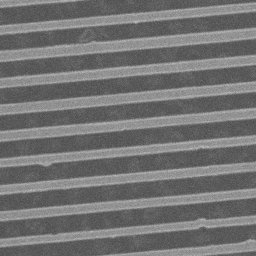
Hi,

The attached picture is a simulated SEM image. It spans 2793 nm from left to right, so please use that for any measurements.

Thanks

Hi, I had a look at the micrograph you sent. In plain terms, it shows parallel lines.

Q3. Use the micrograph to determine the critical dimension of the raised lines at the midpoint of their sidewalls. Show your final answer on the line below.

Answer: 92.3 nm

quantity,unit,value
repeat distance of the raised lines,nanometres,289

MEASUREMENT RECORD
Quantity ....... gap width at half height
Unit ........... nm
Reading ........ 193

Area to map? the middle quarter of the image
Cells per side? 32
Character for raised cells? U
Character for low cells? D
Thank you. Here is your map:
DDDDDDDDDDDDDDDDDDDUUUUUUUUUUUUU
DDDDDDDDUUUUUUUUUUUUUUUUUUUUUUUU
UUUUUUUUUUUUUUUUUUUUUDDDDDDDDDDD
UUUUUUUUUUDDDDDDDDDDDDDDDDDDDDDD
DDDDDDDDDDDDDDDDDDDDDDDDDDDDDDDD
DDDDDDDDDDDDDDDDDDDDDDDDDDDDDDDD
DDDDDDDDDDDDDDDDDDDDDDDDDUUUUUUU
DDDDDDDDDDDDDDDDDUUUUUUUUUUUUUUU
DDDUDDUUUUUUUUUUUUUUUUUUUUUUUDDD
UUUUUUUUUUUUUUUUUUDDDDDDDDDDDDDD
UUUUUUUDDDDDDDDDDDDDDDDDDDDDDDDD
DDDDDDDDDDDDDDDDDDDDDDDDDDDDDDDD
DDDDDDDDDDDDDDDDDDDDDDDDDDDDDDDD
DDDDDDDDDDDDDDDDDDDDDDDUUUUUUUUU
DDDDDDDDDDDDDDUUUUUUUUUUUUUUUUUU
DUUUUUUUUUUUUUUUUUUUUUUUDDDDDDDD
UUUUUUUUUUUUUDDDDDDDDDDDDDDDDDDD
UUDDUDDDDDDDDDDDDDDDDDDDDDDDDDDD
DDDDDDDDDDDDDDDDDDDDDDDDDDDDDDDD
DDDDDDDDDDDDDDDDDDDDDDDDDDDDDDDU
DDDDDDDDDDDDDDDDDDDDDDDUUUUUUUUU
DDDDDDDDDUUUUUUUUUUUUUUUUUUUUUDD
UUUUUUUUUUUUUUUUUUUDDDDDDDDDDDDD
UUUUUUUUDDDDDDDDDDDDDDDDDDDDDDDD
DDDDDDDDDDDDDDDDDDDDDDDDDDDDDDDD
DDDDDDDDDDDDDDDDDDDDDDDDDDDDDDDD
DDDDDDDDDDDDDDDDDDDDDDDDDDDDUUUU
DDDDDDDDDDDDDDDDUUUUUUUUUUUUUUUU
DDDDDDUUUUUUUUUUUUUUUUUUUUUUDDDD
UUUUUUUUUUUUUUUUUDDDDDDDDDDDDDDD
UUUUUUDDDDDDDDDDDDDDDDDDDDDDDDDD
DDDDDDDDDDDDDDDDDDDDDDDDDDDDDDDD